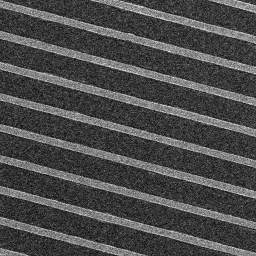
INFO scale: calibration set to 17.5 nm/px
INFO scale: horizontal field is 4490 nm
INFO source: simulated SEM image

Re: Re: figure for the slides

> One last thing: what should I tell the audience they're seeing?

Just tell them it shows parallel lines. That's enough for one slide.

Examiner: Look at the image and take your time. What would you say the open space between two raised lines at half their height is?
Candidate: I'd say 405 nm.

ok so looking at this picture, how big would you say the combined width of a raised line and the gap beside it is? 525 nanometers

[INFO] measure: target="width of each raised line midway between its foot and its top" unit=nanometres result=119